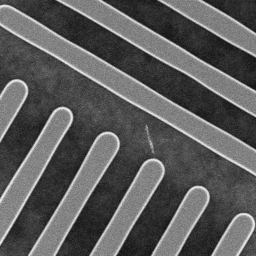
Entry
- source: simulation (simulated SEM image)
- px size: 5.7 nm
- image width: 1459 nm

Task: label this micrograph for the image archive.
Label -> groups of lines, slits or small figures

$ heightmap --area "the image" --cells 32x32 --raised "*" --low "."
........*****........*****......
***.......*****.......******....
****........*****.......*****...
.*****.......*****........*****.
..*****........*****.......*****
....*****........*****.......***
......*****.......*****........*
........*****.......*****.......
.........*****........*****.....
...........*****........*****...
.**.........******.......*****..
***...........*****........*****
***.............*****.......****
***...............*****.......**
**....***..........******.......
*.....***............*****......
*....***...............*****....
.....***....***.........******..
....***....****...........******
...****....***..............****
...***....****....**..........**
..***.....***....****..........*
..***....***.....***............
.***.....***....****....*.......
****....***.....***....***......
***....****....***.....***......
***....***....****....***.......
**....***.....***.....***....***
*.....***....***.....***....****
*....***.....***....****....***.
....****....***.....***....****.
....***.....***....***.....***..